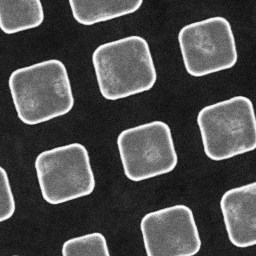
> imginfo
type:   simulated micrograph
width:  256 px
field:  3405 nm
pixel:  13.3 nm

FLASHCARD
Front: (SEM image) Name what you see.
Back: raised bodies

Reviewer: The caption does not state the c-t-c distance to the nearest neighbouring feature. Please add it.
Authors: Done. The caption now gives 1.14 micrometres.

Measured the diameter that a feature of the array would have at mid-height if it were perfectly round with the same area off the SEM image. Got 56.8 pixels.